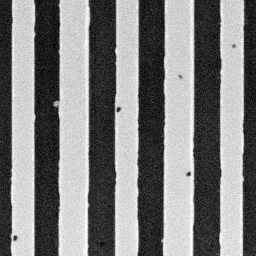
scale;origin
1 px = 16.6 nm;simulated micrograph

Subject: lines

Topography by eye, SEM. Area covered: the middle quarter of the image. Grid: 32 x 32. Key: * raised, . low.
******.......*****.......*******
******.......*****.......*******
******.......*****.......*******
******.......*****.......*******
******.......*****.......*******
******.......*****.......*******
******.......*****.......*******
******.......*****.......*******
******.......*****.......*******
******.......*****.......*******
******.......*****.......*******
******.......*****.......*******
******.......*****.......*******
******.......*****.......*******
******.......*****.......*******
******.......*****.......*******
******.......*****.......*******
******.......*****.......*******
******.......*****.......*******
******.......*****.......*******
******.......*****.......*******
******.......*****.......*******
******.......*****.......*******
******.......*****.......*******
******.......*****.......*******
******.......*****.......*******
******.......*****.......*******
******.......*****.......*******
******.......*****.......*******
******.......*****.......*******
******.......*****.......*******
******.......*****.......*******